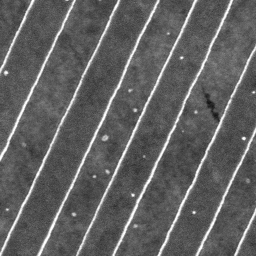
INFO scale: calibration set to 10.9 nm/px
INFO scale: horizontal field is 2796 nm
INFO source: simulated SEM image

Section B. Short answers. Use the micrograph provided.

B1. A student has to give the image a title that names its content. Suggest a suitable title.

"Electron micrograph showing lines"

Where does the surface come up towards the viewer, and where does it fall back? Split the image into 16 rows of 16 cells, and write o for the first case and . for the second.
..oo...ooo..oo..
.ooo...oo...oo..
.ooo..ooo..oo...
ooo...oo...oo...
ooo..ooo..ooo..o
oo...oo...oo...o
oo..ooo..ooo..oo
o...oo...oo...oo
o..ooo..ooo..ooo
...oo...oo...oo.
...oo..ooo..ooo.
..ooo..oo...oo..
..oo..ooo..ooo..
.ooo..oo...ooo..
.oo..ooo...oo..o
ooo..oo...ooo..o